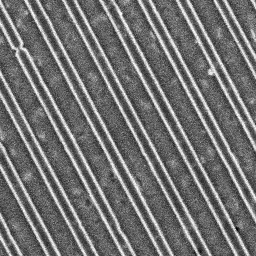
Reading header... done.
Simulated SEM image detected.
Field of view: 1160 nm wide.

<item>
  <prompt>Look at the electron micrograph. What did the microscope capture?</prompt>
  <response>parallel lines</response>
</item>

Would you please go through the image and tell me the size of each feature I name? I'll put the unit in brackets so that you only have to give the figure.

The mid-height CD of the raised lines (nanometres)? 44.9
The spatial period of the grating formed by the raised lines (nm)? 151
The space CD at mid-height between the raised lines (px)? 22.6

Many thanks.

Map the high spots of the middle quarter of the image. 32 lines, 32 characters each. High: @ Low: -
@@-------@@-------@@@-------@@--
@@@------@@@------@@@@------@@@-
@@@-------@@-------@@@-------@@-
-@@@------@@@------@@@@------@@@
-@@@-------@@-------@@@-------@@
--@@@------@@@------@@@@------@@
--@@@-------@@@------@@@-------@
---@@@------@@@-------@@@------@
---@@@-------@@@------@@@-------
----@@@------@@@-------@@@------
----@@@-------@@@------@@@------
-----@@@------@@@-------@@@-----
-----@@@-------@@@------@@@-----
------@@@-------@@-------@@@----
------@@@-------@@@------@@@----
-------@@@-------@@-------@@@---
@------@@@-------@@@------@@@@--
@-------@@@-------@@-------@@@--
@@-------@@-------@@@------@@@@-
@@@------@@@-------@@-------@@@-
@@@-------@@@------@@@------@@@@
-@@@------@@@-------@@-------@@@
-@@@-------@@@------@@@-------@@
--@@@------@@@-------@@@------@@
---@@-------@@@------@@@-------@
---@@@------@@@-------@@@------@
----@@-------@@@------@@@-------
----@@@------@@@-------@@@------
-----@@-------@@@------@@@------
-----@@@------@@@-------@@@-----
------@@-------@@@------@@@-----
------@@@------@@@-------@@@----